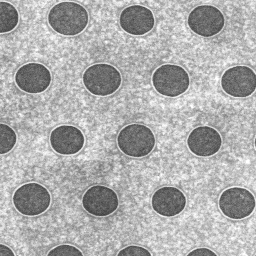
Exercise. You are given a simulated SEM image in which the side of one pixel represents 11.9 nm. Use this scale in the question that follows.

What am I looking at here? a regular array of holes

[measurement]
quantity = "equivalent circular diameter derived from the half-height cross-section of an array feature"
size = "411 nm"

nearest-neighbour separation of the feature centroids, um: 0.816